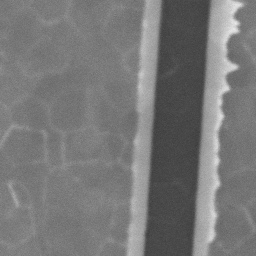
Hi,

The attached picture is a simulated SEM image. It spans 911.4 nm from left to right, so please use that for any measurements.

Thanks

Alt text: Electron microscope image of one or a few lines or trenches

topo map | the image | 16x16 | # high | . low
##########...###
##########...###
##########...###
#########....###
#########....###
#########....###
#########....###
#########....###
#########....###
#########....###
#########....###
#########....###
#########....###
#########....###
#########...####
#########...####